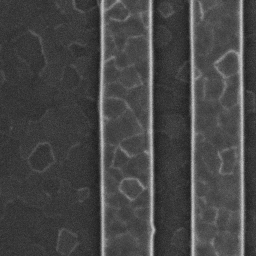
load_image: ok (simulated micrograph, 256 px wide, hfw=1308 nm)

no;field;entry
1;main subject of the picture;one or a few lines or trenches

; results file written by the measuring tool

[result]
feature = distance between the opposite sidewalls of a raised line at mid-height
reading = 0.253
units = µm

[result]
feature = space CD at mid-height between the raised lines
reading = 209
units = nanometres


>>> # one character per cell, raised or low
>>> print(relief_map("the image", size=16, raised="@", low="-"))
------@@@---@@@-
------@@@---@@@-
------@@@---@@@-
------@@@---@@@-
------@@@---@@@-
------@@@---@@@-
------@@@---@@@-
------@@@---@@@-
------@@@---@@@-
------@@@---@@@-
------@@@---@@@-
------@@@---@@@-
------@@@---@@@-
------@@@---@@@-
------@@@@--@@@-
------@@@---@@@-